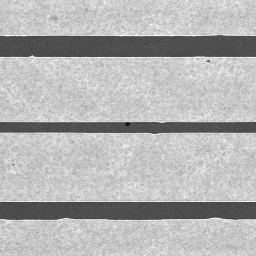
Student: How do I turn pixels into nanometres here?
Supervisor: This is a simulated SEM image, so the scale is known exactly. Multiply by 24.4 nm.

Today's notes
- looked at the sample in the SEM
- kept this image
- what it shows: one or a few lines or trenches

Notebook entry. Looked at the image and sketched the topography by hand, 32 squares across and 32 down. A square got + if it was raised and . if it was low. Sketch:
++++++++++++++++++++++++++++++++
++++++++++++++++++++++++++++++++
++++++++++++++++++++++++++++++++
++++++++++++++++++++++++++++++++
................................
................................
................................
+++++++++++++++++++++++++.++++++
++++++++++++++++++++++++++++++++
++++++++++++++++++++++++++++++++
++++++++++++++++++++++++++++++++
++++++++++++++++++++++++++++++++
++++++++++++++++++++++++++++++++
++++++++++++++++++++++++++++++++
++++++++++++++++++++++++++++++++
................................
................................
++++++++++++++++++++++++++++++++
++++++++++++++++++++++++++++++++
++++++++++++++++++++++++++++++++
+.++++++++++++++++++++++++++++++
++++++++++++++++++++++++++++++++
++++++++++++++++++++++++++++++++
++++++++++++++++++++++++++++++++
++++++++++++++++++++++++++++++++
................................
................................
.......+++...............++++...
++++++++++++++++++++++++++++++++
++++++++++++++++++++++++++++++++
++++++++++++++++++++++++++++++++
++++++++++++++++++++++++++++++++